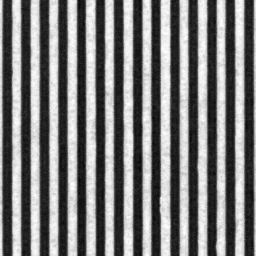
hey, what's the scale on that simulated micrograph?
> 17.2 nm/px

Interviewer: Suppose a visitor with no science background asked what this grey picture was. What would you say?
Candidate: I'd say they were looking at parallel lines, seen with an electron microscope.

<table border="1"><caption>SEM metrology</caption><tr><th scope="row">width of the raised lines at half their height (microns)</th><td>0.161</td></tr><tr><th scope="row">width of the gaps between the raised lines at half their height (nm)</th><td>159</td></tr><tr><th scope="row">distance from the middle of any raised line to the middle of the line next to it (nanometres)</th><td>319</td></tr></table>